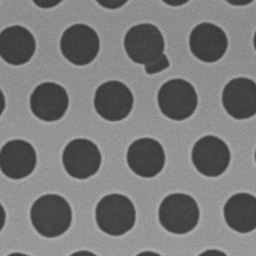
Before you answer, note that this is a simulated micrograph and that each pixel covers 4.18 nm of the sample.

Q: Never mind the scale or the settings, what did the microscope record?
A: a regular array of holes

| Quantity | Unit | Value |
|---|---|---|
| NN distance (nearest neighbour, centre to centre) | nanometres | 266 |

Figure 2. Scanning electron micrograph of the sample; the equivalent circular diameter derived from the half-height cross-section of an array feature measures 40.1 px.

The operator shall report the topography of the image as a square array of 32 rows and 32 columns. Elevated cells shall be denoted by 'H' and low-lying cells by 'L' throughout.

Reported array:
HHHHLLLHHHHHLLLLHHHHHLLHHHHHHLLH
HHHHHHHHHHHHHHHHHHHHHHHHHHHHHHHH
HHHHHHHHHHHHHHHHHHHHHHHHHHHHHHHH
HLLHHHHHHLLHHHHHLLLLHHHHLLLHHHHH
LLLLHHHHLLLLHHHHLLLLHHHHLLLLHHHH
LLLLHHHLLLLLHHHHLLLLLHHHLLLLHHHH
LLLLHHHHLLLLHHHHLLLLLHHHLLLLHHHH
LLLLHHHHLLLLHHHHLLLLLHHHHLLHHHHH
HHHHHHHHHHHHHHHHHHLLLHHHHHHHHHHH
HHHHHHHHHHHHHHHHHHHHHHHHHHHHHHHH
HHHHHLLHHHHHHLLHHHHHLLLLHHHHLLLL
HHHHLLLLHHHHLLLLHHHHLLLLHHHHLLLL
LHHHLLLLLHHHLLLLLHHHLLLLLHHHLLLL
LHHHLLLLHHHHLLLLHHHHLLLLHHHHLLLL
HHHHHLLLHHHHHLLLHHHHHLLLHHHHHLLL
HHHHHHHHHHHHHHHHHHHHHHHHHHHHHHHH
HHHHHHHHHHHHHHHHHHHHHHHHHHHHHHHH
HHLHHHHHHLLHHHHHHLLHHHHHHLLLHHHH
LLLLHHHHLLLLHHHHLLLLHHHHLLLLLHHH
LLLLHHHHLLLLLHHHLLLLLHHHLLLLLHHH
LLLLHHHHLLLLLHHHLLLLLHHHLLLLLHHH
LLLLHHHHLLLLHHHHHLLLHHHHHLLLHHHH
HHHHHHHHHHHHHHHHHHHHHHHHHHHHHHHH
HHHHHHHHHHHHHHHHHHHHHHHHHHHHHHHH
HHHHHLLHHHHHHLLLHHHHHLLLHHHHHLLL
HHHHLLLLLHHHLLLLLHHHLLLLLHHHLLLL
LHHHLLLLLHHHLLLLLHHHLLLLLHHHLLLL
LHHHLLLLLHHHLLLLLHHHLLLLLHHHLLLL
HHHHLLLLLHHHLLLLHHHHHLLLHHHHHLLL
HHHHHHLHHHHHHHHHHHHHHHHHHHHHHHHH
HHHHHHHHHHHHHHHHHHHHHHHHHHHHHHHH
HHHHHHHHHHLHHHHHHHLHHHHHHHLLHHHH